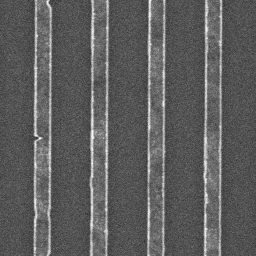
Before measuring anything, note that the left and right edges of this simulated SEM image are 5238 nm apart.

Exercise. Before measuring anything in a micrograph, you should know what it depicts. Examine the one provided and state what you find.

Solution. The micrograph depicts parallel lines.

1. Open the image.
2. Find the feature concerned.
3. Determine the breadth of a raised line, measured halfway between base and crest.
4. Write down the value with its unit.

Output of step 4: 307 nm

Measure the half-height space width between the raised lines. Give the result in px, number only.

41.9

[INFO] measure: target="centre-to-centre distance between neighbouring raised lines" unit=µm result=1.16